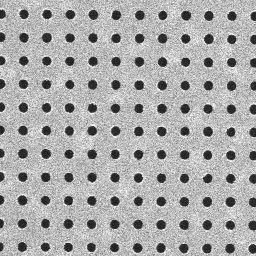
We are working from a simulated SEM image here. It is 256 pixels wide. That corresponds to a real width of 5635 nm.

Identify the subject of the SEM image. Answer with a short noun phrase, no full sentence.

a regular array of holes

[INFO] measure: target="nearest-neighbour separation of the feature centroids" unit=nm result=505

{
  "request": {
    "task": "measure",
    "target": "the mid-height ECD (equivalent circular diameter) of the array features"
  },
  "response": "212 nm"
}